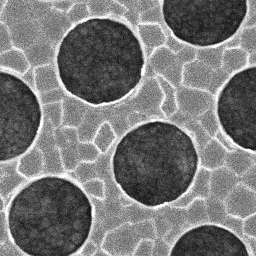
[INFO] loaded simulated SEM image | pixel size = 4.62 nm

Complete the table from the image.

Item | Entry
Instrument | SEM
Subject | holes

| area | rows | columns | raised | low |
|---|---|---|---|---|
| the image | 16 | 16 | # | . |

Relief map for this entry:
##########.....#
#####...##.....#
####.....##...##
####.....#######
####.....######.
..##....######..
..############..
...###########..
..######....##..
.######.....####
#######.....####
##...##.....####
#....###...#####
#.....##########
#.....######..##
#....######....#